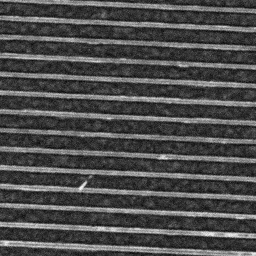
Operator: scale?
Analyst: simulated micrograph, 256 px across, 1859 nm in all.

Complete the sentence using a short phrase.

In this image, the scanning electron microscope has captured parallel lines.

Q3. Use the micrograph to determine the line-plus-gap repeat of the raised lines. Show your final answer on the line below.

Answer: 0.136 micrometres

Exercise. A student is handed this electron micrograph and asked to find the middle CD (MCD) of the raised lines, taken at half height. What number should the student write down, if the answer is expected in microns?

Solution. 0.0272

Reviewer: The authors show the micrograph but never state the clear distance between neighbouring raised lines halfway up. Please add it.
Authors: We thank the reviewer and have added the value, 109 nm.